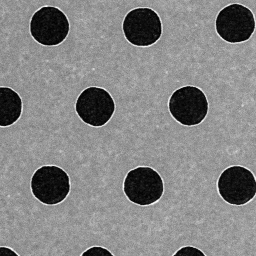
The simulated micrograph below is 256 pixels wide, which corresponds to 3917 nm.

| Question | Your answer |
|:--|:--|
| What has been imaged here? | holes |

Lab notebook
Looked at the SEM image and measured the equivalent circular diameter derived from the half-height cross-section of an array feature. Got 601 nanometres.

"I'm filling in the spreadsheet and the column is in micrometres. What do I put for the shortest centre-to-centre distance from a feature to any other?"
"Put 1.4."